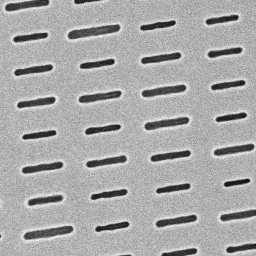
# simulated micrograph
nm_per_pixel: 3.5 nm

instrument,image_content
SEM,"a regular array of holes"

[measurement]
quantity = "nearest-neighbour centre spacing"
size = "114 nm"